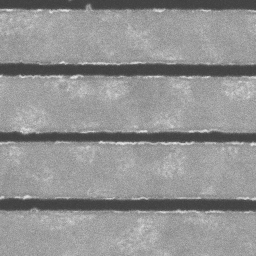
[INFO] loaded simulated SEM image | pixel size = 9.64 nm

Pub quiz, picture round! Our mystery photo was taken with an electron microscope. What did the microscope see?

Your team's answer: one or a few lines or trenches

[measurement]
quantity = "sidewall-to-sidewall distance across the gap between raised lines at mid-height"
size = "53.4 px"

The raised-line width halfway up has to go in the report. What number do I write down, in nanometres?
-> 134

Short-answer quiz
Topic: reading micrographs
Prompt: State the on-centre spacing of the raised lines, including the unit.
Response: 647 nanometers